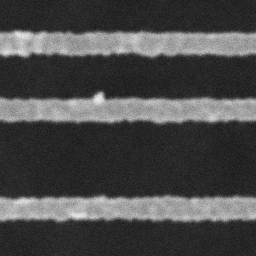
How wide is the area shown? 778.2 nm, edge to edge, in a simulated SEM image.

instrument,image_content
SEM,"lines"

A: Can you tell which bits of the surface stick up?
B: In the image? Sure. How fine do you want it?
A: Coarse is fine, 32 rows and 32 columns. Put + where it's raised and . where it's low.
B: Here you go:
................................
................................
................................
................................
++++++++++++++++++++++++++++++++
++++++++++++++++++++++++++++++++
++++++++++++++++.+++++++++++++++
................................
................................
................................
................................
................................
+.+.+.+..++++++++++++..++++..+.+
+++++++++.++++++++++++++++++++++
++++++++++++++++++++++++++++++++
................................
................................
................................
................................
................................
................................
................................
................................
................................
................................
++++++++++++++++++++++++++++++++
++++++++++++++++++++++++++++++++
.......+..............++........
................................
................................
................................
................................